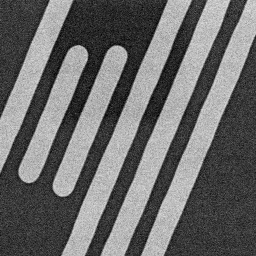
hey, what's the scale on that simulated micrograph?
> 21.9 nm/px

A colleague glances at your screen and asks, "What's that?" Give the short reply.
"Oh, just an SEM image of groups of lines, slits or small figures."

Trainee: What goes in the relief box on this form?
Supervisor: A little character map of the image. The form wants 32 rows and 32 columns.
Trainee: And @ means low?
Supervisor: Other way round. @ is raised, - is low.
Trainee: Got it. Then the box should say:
------@@@------------@@@--@@@--@
------@@------------@@@--@@@--@@
-----@@@------------@@@--@@@--@@
-----@@@------------@@---@@--@@@
----@@@------------@@@--@@@--@@@
----@@@------------@@@--@@@--@@-
----@@---@@--@@@--@@@--@@@--@@@-
---@@@--@@@--@@@--@@@--@@@--@@@-
---@@@--@@---@@---@@--@@@--@@@--
--@@@--@@@--@@@--@@@--@@@--@@@--
--@@@--@@@--@@@--@@---@@---@@---
-@@@--@@@--@@@--@@@--@@@--@@@---
-@@@--@@@--@@@--@@@--@@@--@@@---
-@@---@@--@@@---@@--@@@--@@@----
@@@--@@@--@@@--@@@--@@@--@@@----
@@@--@@---@@---@@---@@---@@-----
@@--@@@--@@@--@@@--@@@--@@@-----
@@--@@@--@@@--@@@--@@---@@------
@---@@--@@@--@@@--@@@--@@@------
@--@@@--@@@--@@@--@@@--@@@------
---@@@--@@--@@@---@@--@@@-------
--@@@--@@@--@@@--@@@--@@@-------
---@---@@@--@@---@@---@@--------
-------@@--@@@--@@@--@@@--------
-----------@@@--@@@--@@@--------
----------@@@--@@@--@@@---------
----------@@@--@@@--@@@---------
----------@@---@@--@@@----------
---------@@@--@@@--@@@----------
---------@@@--@@@--@@-----------
--------@@@--@@@--@@@-----------
--------@@@--@@@--@@@-----------